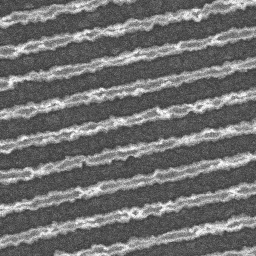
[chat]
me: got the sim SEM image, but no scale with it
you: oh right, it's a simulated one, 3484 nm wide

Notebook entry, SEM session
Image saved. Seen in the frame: parallel lines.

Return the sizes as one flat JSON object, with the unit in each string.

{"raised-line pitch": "417 nanometers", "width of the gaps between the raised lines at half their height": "300 nm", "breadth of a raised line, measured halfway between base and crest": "115 nanometres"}